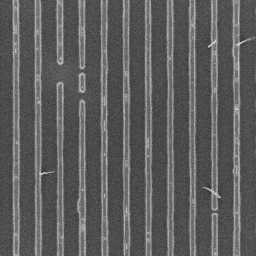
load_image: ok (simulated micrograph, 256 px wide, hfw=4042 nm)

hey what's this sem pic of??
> parallel lines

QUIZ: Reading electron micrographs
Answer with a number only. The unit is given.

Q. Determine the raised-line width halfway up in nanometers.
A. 88.8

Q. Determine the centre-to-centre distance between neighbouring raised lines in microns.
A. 0.348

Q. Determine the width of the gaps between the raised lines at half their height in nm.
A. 256